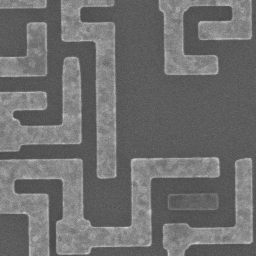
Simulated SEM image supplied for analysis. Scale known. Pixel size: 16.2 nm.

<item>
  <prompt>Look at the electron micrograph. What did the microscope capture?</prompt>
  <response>wiring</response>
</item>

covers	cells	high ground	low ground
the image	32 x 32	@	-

@@@@@@--@@@@@@------@@@@@@@@@@@-
--------@@----------@@@------@@-
--------@@-----------@@------@@-
---@@@--@@@@@@-------@@--@@@@@@-
---@@@--@@@@@@-------@@--@@@@@@-
---@@@------@@-------@@---------
---@@@------@@-------@@---------
@@@@@@--@@--@@-------@@@@@@-----
@@@@@@--@@--@@-------@@@@@@-----
@@@-----@@--@@------------------
--------@@--@@------------------
----@---@@--@@------------------
@@@@@@--@@--@@------------------
@@@@@@--@@--@@------------------
@@------@@--@@------------------
@@@-----@@--@@------------------
@@@@@@@@@@--@@------------------
@@@@@@@@@@--@@------------------
@@@---------@@------------------
------------@@------------------
@@@@@@@@@@--@@--@@@@@@@@@@@--@@-
@@@@@@@@@@--@@--@@@@@@@@@@@--@@-
@@-----@@@------@@@----------@@-
@@------@@-------@@----------@@-
@@@@@@--@@-------@@--@@@@@@--@@-
@@@@@@--@@-------@@--@@@@@@--@@@
@@@@@@--@@-------@@-----------@@
----@@-@@@@------@@-----------@@
----@@-@@@@@@@@@@@@-@@@@---@@@@@
----@@-@@@@@@@@@@@@-@@@@@@@@@@@@
----@@-@@@@@@@@@@@@-@@@@@-------
----@@-@@@@----------@@---------